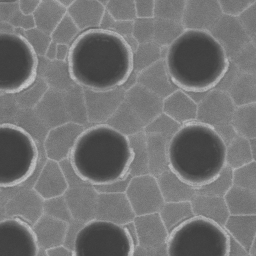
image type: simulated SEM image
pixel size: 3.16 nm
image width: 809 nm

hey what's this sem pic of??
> holes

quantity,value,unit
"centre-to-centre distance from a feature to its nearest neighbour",298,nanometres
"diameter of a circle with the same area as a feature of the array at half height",163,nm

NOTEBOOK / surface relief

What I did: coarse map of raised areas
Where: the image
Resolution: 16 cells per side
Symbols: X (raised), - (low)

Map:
XXXXXXXXXXXXXXXX
XXXXXXXXXXXXXXXX
-XXXX--XXXX--XXX
--XXX---XXX---XX
--XXX---XXX---XX
XXXXXXXXXXXXXXXX
XXXXXXXXXXXXXXXX
XXXXXXXXXXXXXXXX
-XXXX--XXXX--XXX
--XXX---XXX---XX
--XXX---XXX---XX
XXXXXXXXXXXXXXXX
XXXXXXXXXXXXXXXX
XXXXXXXXXXXXXXXX
--XXX---XXX---XX
--XXX---XXX---XX